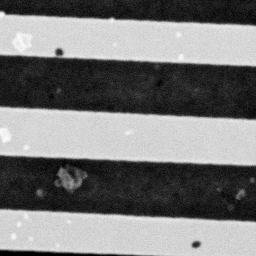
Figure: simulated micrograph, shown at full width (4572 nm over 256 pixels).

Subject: lines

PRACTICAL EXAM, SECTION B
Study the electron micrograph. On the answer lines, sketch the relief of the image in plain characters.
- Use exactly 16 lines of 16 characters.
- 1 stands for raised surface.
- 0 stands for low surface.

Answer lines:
0000000000000000
1111111111111000
1111111111111111
0011111111111111
0000000000000000
0000000000000000
0000000000000000
1111111111111111
1111111111111111
1111111111111111
0000000000000000
0000000000000000
0000000000000000
1111111100000000
1111111111111111
1111111111111111